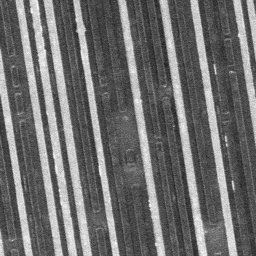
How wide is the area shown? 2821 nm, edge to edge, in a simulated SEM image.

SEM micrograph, parallel lines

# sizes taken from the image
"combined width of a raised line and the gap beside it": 158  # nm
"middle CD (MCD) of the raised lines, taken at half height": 73.5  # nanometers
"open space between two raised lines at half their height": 84.4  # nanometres